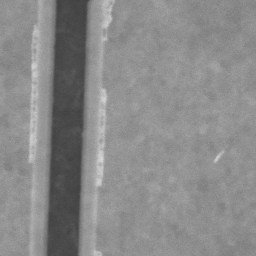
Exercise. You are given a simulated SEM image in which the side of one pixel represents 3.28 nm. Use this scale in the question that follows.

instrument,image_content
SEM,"one or a few lines or trenches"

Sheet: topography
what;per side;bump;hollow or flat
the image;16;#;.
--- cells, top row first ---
###...##########
###...##########
###...##########
###...##########
###...##########
###...##########
###...##########
###...##########
###...##########
##....##########
##....##########
##....##########
##....##########
##....##########
##....##########
##....##########